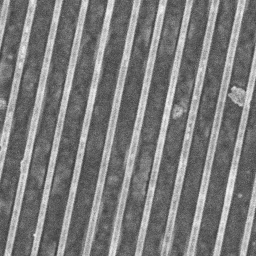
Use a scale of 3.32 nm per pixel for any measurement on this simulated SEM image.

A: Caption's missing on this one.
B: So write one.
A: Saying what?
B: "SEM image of parallel lines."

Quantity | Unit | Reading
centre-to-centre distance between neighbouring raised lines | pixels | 25.7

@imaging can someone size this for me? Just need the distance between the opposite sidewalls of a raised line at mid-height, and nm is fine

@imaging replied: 19.9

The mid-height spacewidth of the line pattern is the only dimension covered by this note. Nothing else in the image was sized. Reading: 65.5 nanometres